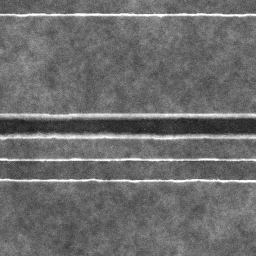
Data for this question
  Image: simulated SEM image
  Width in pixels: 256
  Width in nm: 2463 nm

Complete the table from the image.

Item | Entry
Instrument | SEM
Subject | lines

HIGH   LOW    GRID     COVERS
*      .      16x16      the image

****************
****************
****************
****************
****************
****************
****************
................
................
****************
****************
****************
****************
****************
****************
****************